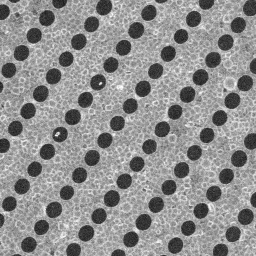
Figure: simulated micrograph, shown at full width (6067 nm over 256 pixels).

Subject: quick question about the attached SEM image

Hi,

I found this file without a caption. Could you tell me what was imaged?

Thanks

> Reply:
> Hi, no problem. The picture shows a regular array of holes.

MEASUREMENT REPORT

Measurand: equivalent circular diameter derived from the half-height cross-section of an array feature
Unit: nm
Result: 393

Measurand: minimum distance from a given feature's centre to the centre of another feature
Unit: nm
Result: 504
